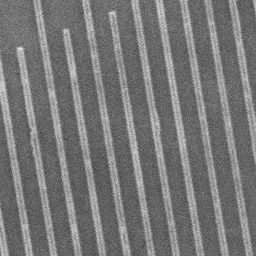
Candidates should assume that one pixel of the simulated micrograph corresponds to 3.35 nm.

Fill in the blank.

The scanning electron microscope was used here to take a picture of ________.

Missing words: parallel lines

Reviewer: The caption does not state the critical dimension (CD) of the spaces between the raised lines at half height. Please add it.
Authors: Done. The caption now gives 65.3 nm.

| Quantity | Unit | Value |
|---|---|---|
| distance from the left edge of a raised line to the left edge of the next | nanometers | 80.9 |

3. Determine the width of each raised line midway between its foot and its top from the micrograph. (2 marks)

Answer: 16.9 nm